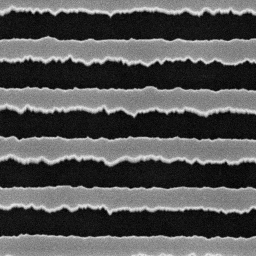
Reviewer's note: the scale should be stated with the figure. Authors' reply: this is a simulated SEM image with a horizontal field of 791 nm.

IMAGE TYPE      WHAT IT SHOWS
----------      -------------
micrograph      lines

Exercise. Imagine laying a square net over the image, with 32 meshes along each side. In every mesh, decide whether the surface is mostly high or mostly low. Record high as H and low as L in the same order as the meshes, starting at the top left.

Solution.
HHHHHHHHHHHHHHHHHHHHHHHHHHHHHHHH
HLLLLLHLLLLHHHHHLLLLHHHLHHHHLHHH
LLLLLLLLLLLLLLLLLLLLLLLLLLLLLLLL
LLLLLLLLLLLLLLLLLLLLLLLLLLLLLLLL
LLLLLLLLLLLLLLLLLLLLLLLLLLLLLLLL
HHHHHHHHHHHHHHHHHHHHHHHHHHHHHHHH
HHHHHHHHHHHHHHHHHHHHHHHHHHHHHHHH
HHHLHHHHLHHHHLHHHHHHHHHLHHHHHHHH
LLLLLLLLLLLLLLLLLLLLLLLLLLLLLLLL
LLLLLLLLLLLLLLLLLLLLLLLLLLLLLLLL
LLLLLLLLLLLLLLLLLLLLLLLLLLLLLLLL
HHHHHHHHHHHHHHHHHHHHHHHHHHHHHHHH
HHHHHHHHHHHHHHHHHHHHHHHHHHHHHHHH
LHHHHHHHHHHHHHHHHHHHHHHHHHHHHHHH
LLLLLLLLLLLLLLLLLLLLLLLLLLLLLLLL
LLLLLLLLLLLLLLLLLLLLLLLLLLLLLLLL
LLLLLLLLLLLLLLLLLLLLLLLLLLLLLLLL
HHHHHHHHHHHHHHHHHHHHHHHHHHHHHHHL
HHHHHHHHHHHHHHHHHHHHHHHHHHHHHHHH
HHHHHHHHHHHHHHHHHHHHHHHHHHHHHHHH
LLLLLLLLLLLLLHLLLLLLLLLLLLLLLLLL
LLLLLLLLLLLLLLLLLLLLLLLLLLLLLLLL
LLLLLLLLLLLLLLLLLLLLLLLLLLLLLLLL
LLHLLHHHHHHLHLHLLLLHLLHHLHLHLLLL
HHHHHHHHHHHHHHHHHHHHHHHHHHHHHHHH
HHHHHHHHHHHHHHHHHHHHHHHHHHHHHHHH
LLLLLLLLLLLLLLLLLLLLLLLLLLLLHLLL
LLLLLLLLLLLLLLLLLLLLLLLLLLLLLLLL
LLLLLLLLLLLLLLLLLLLLLLLLLLLLLLLL
LLHHHHHHLHLLLHLLHLLHHLHLHLLLLLLL
HHHHHHHHHHHHHHHHHHHHHHHHHHHHHHHH
HHHHHHHHHHHHHHHHHHHHHHHHHHHHHHHH